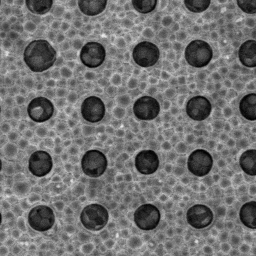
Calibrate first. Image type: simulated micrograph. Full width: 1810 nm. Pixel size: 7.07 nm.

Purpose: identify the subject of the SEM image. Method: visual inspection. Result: a regular array of holes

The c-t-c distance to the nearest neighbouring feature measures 372 nm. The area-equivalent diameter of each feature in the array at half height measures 190 nm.